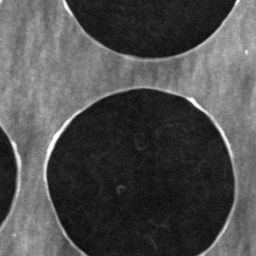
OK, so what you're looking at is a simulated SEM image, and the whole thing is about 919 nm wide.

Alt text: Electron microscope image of holes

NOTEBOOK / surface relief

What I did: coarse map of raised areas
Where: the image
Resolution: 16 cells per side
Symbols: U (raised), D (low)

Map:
UUUUDDDDDDDDDDDU
UUUUUDDDDDDDDDUU
UUUUUUDDDDDDDUUU
UUUUUUUUDDDUUUUU
UUUUUUUUUUUUUUUU
UUUUUUUUUUUUUUUU
UUUUUUDDDDDDUUUU
UUUUUDDDDDDDDUUU
UUUUDDDDDDDDDDUU
DUUDDDDDDDDDDDUU
DUUDDDDDDDDDDDDU
DUUDDDDDDDDDDDDU
DUUDDDDDDDDDDDDU
DUUUDDDDDDDDDDUU
UUUUDDDDDDDDDDUU
UUUUUDDDDDDDDUUU